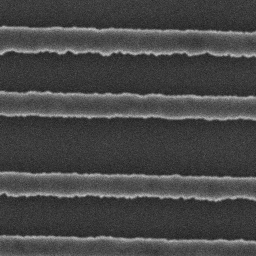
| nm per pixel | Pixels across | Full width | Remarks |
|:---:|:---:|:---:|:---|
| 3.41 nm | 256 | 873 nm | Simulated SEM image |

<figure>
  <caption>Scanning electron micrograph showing lines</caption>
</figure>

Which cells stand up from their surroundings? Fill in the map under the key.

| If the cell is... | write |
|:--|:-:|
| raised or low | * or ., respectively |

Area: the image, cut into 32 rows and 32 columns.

................................
................................
................................
****..**.*......................
********************************
********************************
*.***..*.***********************
................................
................................
................................
................................
*...*...........................
********************************
********************************
......**************************
................................
................................
................................
................................
................................
................................
................................
********************************
********************************
.*.....***..********************
................................
................................
................................
................................
*...............................
********************************
********************************